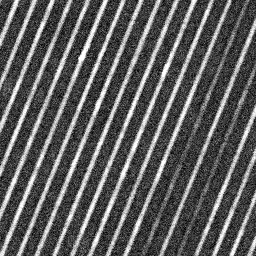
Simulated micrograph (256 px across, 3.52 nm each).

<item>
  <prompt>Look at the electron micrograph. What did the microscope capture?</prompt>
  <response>parallel lines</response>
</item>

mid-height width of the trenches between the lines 49.3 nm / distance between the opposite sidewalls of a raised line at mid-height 6.5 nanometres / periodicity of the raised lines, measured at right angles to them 57.8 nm